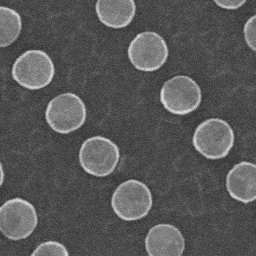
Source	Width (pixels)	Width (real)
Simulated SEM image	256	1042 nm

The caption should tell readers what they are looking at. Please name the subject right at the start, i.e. raised bodies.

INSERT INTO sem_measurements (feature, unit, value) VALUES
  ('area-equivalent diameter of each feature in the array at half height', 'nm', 159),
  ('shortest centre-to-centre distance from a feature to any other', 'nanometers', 222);